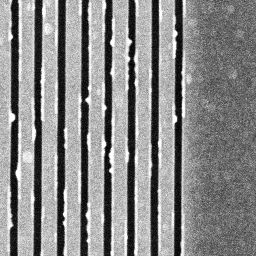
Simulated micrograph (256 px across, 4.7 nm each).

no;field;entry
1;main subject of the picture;parallel lines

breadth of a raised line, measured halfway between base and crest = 73.5 nanometers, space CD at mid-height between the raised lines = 0.037 microns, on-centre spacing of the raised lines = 110 nanometres